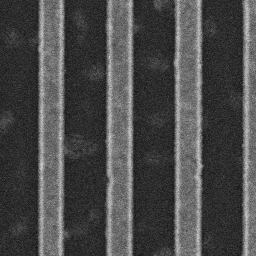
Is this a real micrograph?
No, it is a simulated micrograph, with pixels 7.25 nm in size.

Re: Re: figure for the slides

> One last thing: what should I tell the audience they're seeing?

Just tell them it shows one or a few lines or trenches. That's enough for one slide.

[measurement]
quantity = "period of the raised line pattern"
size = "0.496 micrometres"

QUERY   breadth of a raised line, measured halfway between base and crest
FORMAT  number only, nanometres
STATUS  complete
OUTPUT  142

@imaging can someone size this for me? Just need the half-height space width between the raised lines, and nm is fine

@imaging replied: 349